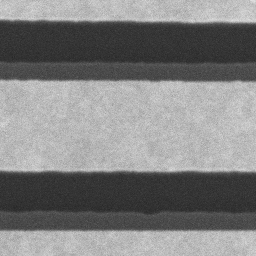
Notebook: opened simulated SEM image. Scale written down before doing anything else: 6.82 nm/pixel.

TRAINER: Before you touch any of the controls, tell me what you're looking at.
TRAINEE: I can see lines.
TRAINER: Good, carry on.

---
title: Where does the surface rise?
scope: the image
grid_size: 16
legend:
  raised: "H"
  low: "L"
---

HHHHHHHHHHHHHHHH
LLLLLLLLLLLLLLLL
LLLLLLLLLLLLLLLL
LLLLLLLLLLLLLLLL
HHHHHHHHHHHHHHHH
HHHHHHHHHHHHHHHH
HHHHHHHHHHHHHHHH
HHHHHHHHHHHHHHHH
HHHHHHHHHHHHHHHH
HHHHHHHHHHHHHHHH
HHHHHHHHHHHHHHHH
LLLLLLLLLLLLLLLL
LLLLLLLLLLLLLLLL
HHHHHHHHHHHHHHHH
HHHHHHHHHHHHHHHH
HHHHHHHHHHHHHHHH